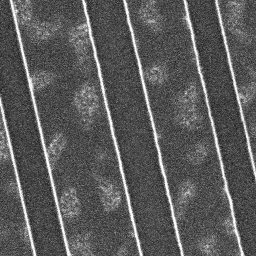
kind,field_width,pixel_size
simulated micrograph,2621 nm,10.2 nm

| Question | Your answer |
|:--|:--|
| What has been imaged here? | one or a few lines or trenches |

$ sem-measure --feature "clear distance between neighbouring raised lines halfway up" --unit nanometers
336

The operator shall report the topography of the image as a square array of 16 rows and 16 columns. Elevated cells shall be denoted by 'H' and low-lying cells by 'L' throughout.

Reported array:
LHHHHLLLHHHHLLHH
LHHHHHLLHHHHLLHH
LHHHHHLLHHHHLLHH
LHHHHHLLLHHHLLHH
LLHHHHLLLHHHHLLH
LLHHHHLLLHHHHLLH
LLHHHHHLLHHHHLLH
LLHHHHHLLHHHHLLH
HLLHHHHLLLHHHLLH
HLLHHHHLLLHHHHLL
HLLHHHHHLLHHHHLL
HLLHHHHHLLHHHHLL
HLLHHHHHLLLHHHLL
HHLLHHHHLLLHHHHL
HHLLHHHHLLLHHHHL
HHLLHHHHHLLHHHHL